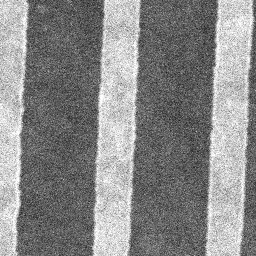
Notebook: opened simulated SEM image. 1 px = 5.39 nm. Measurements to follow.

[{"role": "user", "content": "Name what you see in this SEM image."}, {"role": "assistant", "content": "one or a few lines or trenches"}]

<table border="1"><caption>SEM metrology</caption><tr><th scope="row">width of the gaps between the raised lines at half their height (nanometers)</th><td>427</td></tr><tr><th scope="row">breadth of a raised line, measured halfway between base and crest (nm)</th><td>177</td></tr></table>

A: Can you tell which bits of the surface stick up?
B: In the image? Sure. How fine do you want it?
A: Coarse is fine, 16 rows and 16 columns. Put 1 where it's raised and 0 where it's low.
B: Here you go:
1100000110000011
1100000110000011
1100001110000011
1000001110000011
1000001110000110
1000001100000110
1000001100000110
1000001100000110
1000001100000110
1000001100000110
1000001100000110
1000001100000110
1000001100000110
1000001100000110
1000001100000110
1000001100000110